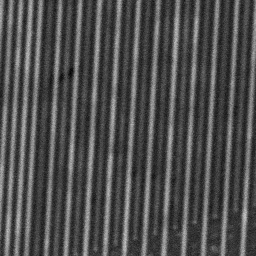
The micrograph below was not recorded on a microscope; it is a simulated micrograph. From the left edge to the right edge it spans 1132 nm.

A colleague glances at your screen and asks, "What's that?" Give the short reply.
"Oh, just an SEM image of parallel lines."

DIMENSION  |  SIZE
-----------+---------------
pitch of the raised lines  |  0.0433 µm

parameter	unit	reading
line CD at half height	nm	13.8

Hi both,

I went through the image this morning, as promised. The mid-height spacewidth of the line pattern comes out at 27.6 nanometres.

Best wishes